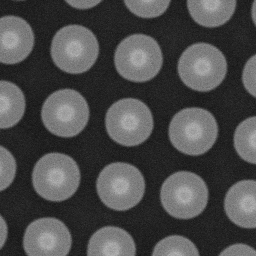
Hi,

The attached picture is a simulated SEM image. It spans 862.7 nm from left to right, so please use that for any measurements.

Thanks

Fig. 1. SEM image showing an array of small figures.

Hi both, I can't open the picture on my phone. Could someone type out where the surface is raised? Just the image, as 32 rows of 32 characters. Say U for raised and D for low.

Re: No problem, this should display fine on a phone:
DDDDDDDDDUUUDDDDUUUUUDDUUUUUUDDD
DDDDDDDDDDDDDDDDUUUUDDDDUUUUUDDU
UUUDDDDDDDDDDDDDDDDDDDDDUUUUDDDD
UUUUDDDDUUUDDDDDDDDDDDDDDDDDDDDD
UUUUDDDUUUUUDDDDUUDDDDDDDDDDDDDD
UUUUDDUUUUUUDDDUUUUUDDDDUUDDDDDD
UUUUDDUUUUUUDDUUUUUUDDDUUUUUDDDD
UUUDDDDUUUUUDDUUUUUUDDUUUUUUDDDU
DDDDDDDDUUUDDDDUUUUUDDUUUUUUDDDU
DDDDDDDDDDDDDDDUUUUDDDUUUUUUDDUU
UUDDDDDDDDDDDDDDDDDDDDDUUUUDDDUU
UUUDDDDUUUDDDDDDDDDDDDDDDDDDDDDU
UUUDDDUUUUUDDDDUUDDDDDDDDDDDDDDD
UUUDDUUUUUUDDDUUUUDDDDDDUDDDDDDD
UUUDDUUUUUUDDUUUUUUDDDUUUUUDDDDD
UUDDDDUUUUUDDUUUUUUDDUUUUUUDDDUU
DDDDDDUUUUDDDUUUUUUDDUUUUUUDDUUU
DDDDDDDDDDDDDDUUUUDDDUUUUUUDDUUU
UDDDDDDDDDDDDDDDDDDDDDUUUUDDDUUU
UUDDDDUUDDDDDDDDDDDDDDDDDDDDDDUU
UUDDDUUUUUDDDDUUDDDDDDDDDDDDDDDD
UUDDUUUUUUDDDUUUUDDDDDUDDDDDDDDD
UUDDUUUUUUDDUUUUUUDDDUUUUDDDDDDD
UDDDUUUUUUDDUUUUUUDDUUUUUUDDDUUU
DDDDDUUUUDDDUUUUUUDDUUUUUUDDUUUU
DDDDDDDDDDDDDUUUUDDDUUUUUUDDUUUU
DDDDDDDDDDDDDDDDDDDDDUUUUDDDUUUU
DDDDDUUDDDDDDDDDDDDDDDDDDDDDDUUU
UDDUUUUUDDDDDUUDDDDDDDDDDDDDDDDD
UDDUUUUUUDDDUUUUDDDDDUDDDDDDDDDD
DDDUUUUUUDDUUUUUUDDDUUUUDDDDDDDD
DDDUUUUUUDDUUUUUUDDUUUUUUDDDUUUU